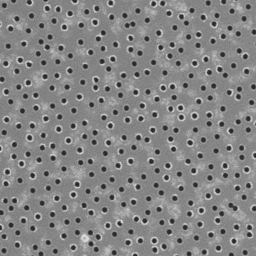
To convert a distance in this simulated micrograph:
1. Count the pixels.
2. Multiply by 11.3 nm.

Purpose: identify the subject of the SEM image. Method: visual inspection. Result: a regular array of holes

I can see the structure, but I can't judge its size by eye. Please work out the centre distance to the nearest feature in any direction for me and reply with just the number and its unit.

128 nm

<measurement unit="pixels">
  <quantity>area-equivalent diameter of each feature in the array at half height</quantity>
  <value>5.29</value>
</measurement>